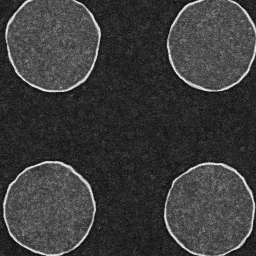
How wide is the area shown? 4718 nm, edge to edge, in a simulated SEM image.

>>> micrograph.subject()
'raised bodies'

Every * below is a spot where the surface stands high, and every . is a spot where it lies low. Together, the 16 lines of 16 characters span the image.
.****.......***.
.*****.....*****
******.....*****
.*****.....*****
.*****.....****.
..**.........*..
................
................
................
................
..**........**..
.****......****.
******....******
******....******
.****......*****
..***.......***.